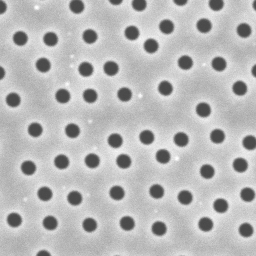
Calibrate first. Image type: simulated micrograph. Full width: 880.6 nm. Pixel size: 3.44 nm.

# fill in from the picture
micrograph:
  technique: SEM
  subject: a regular array of holes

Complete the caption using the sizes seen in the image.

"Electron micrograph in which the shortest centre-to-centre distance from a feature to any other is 0.103 um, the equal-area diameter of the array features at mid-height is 50.4 nanometers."